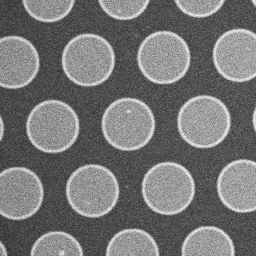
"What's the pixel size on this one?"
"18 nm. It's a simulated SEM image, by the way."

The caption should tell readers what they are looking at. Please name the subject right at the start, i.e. an array of small figures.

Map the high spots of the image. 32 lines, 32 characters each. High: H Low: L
LLLHHHHHHLLLLHHHHHLLLLHHHHHHLLLL
LLLLHHHHHLLLLHHHHHLLLLLHHHHLLLLL
LLLLLHHLLLLLLLLLLLLLLLLLLLLLLLLL
LLLLLLLLLLLLLLLLLLLLLLLLLLLLLLLL
LLLLLLLLLLHHLLLLLLLHHHLLLLLLHHHH
HHHHLLLLHHHHHHLLLLHHHHHLLLLHHHHH
HHHHHLLLHHHHHHLLLHHHHHHHLLLHHHHH
HHHHHLLLHHHHHHLLLHHHHHHHLLLHHHHH
HHHHHLLLHHHHHHLLLHHHHHHHLLLHHHHH
HHHHLLLLHHHHHHLLLLHHHHHLLLLLHHHH
HHHLLLLLLLHHLLLLLLLLLLLLLLLLLLLL
LLLLLLLLLLLLLLLLLLLLLLLLLLLLLLLL
LLLLLLLLLLLLLLLHHLLLLLLLHHHLLLLL
LLLLHHHHHLLLLHHHHHHLLLLHHHHHLLLL
LLLLHHHHHHLLLHHHHHHLLLHHHHHHHLLL
LLLHHHHHHHLLLHHHHHHLLLHHHHHHHLLL
LLLHHHHHHHLLLHHHHHHLLLHHHHHHLLLL
LLLLHHHHHLLLLHHHHHHLLLLHHHHHLLLL
LLLLLHHHLLLLLLLHHLLLLLLLLLLLLLLL
LLLLLLLLLLLLLLLLLLLLLLLLLLLLLLLL
LLLLLLLLLLLLLLLLLLLLHHLLLLLLLHHH
HHHHLLLLLHHHHHLLLLHHHHHHLLLLHHHH
HHHHHLLLLHHHHHLLLLHHHHHHLLLHHHHH
HHHHHLLLHHHHHHHLLLHHHHHHLLLHHHHH
HHHHHLLLHHHHHHHLLLHHHHHHLLLHHHHH
HHHHHLLLLHHHHHLLLLHHHHHHLLLLHHHH
HHHHLLLLLLHHHLLLLLLLHHHLLLLLLLHL
LLLLLLLLLLLLLLLLLLLLLLLLLLLLLLLL
LLLLLLLLLLLLLLLLLLLLLLLLLHHLLLLL
LLLLLHHHHLLLLLHHHHHLLLLHHHHHHLLL
LLLLHHHHHHLLLLHHHHHHLLLHHHHHHLLL
HLLLHHHHHHLLLHHHHHHHLLLHHHHHHLLL